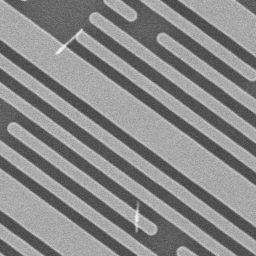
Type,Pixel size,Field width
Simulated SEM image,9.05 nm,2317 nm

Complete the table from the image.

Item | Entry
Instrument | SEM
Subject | groups of lines, slits or small figures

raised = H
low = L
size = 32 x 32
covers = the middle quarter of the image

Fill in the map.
HHHHHHHLLLLLHHHHHLLLLLHHHHHLLLLL
HHHHHHHHLLLLLHHHHHLLLLLHHHHHLLLL
HHHHHHHHHHLLLLLHHHHLLLLLHHHHHLLL
HHHHHHHHHHHLLLLLHHHHHLLLLLHHHHHL
HHHHHHHHHHHHHLLLLHHHHHLLLLLHHHHH
HHHHHHHHHHHHHHLLLLHHHHHLLLLLHHHH
LHHHHHHHHHHHHHHLLLLLHHHHHLLLLLHH
LLHHHHHHHHHHHHHHHLLLLHHHHHLLLLLH
LLLLHHHHHHHHHHHHHHLLLLLHHHHHLLLL
LLLLLHHHHHHHHHHHHHHLLLLLHHHHHLLL
HHLLLLLHHHHHHHHHHHHHHLLLLHHHHHLL
HHHLLLLLHHHHHHHHHHHHHHLLLLLHHHHH
HHHHHLLLLHHHHHHHHHHHHHHLLLLLHHHH
LHHHHHLLLLLHHHHHHHHHHHHHHLLLLHHH
LLLHHHHLLLLLHHHHHHHHHHHHHHLLLLLH
LLLLHHHHHLLLLHHHHHHHHHHHHHHHLLLL
LLLLLHHHHHLLLLLHHHHHHHHHHHHHHLLL
HLLLLLLHHHHLLLLLHHHHHHHHHHHHHHLL
HHHLLLLLHHHHHLLLLHHHHHHHHHHHHHHH
HHHHLLLLLHHHHHLLLLLHHHHHHHHHHHHH
LHHHHLLLLLLHHHHHLLLLHHHHHHHHHHHH
LLHHHHHLLLLLHHHHHLLLLLHHHHHHHHHH
LLLHHHHHLLLLLHHHHHLLLLLHHHHHHHHH
LLLLLHHHHHLLLLLHHHHHLLLLHHHHHHHH
HLLLLLHHHHHLLLLLHHHHHLLLLLHHHHHH
HHHLLLLLHHHHHLLLLHHHHHLLLLLHHHHH
HHHHLLLLLHHHHHLLLLLHHHHHLLLLHHHH
HHHHHLLLLLHHHHHLLLLLHHHHHLLLLLHH
LLHHHHHLLLLHHHHHHLLLLHHHHHLLLLLH
LLLHHHHHLLLLLHHHHHLLLLLHHHHHLLLL
LLLLHHHHHLLLLLHHHHHLLLLLHHHHHHLL
HLLLLLHHHHHLLLLLHHHHHLLLLLHHHHHL